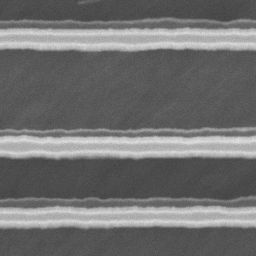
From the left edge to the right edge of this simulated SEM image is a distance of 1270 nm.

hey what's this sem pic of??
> lines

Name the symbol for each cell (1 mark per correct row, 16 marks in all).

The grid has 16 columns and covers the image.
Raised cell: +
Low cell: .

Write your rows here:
................
++++++++++++++++
++++++++++++++++
................
................
................
................
................
++++++++++++++++
++++++++++++++++
................
................
+++++++++++++..+
++++++++++++++++
................
................